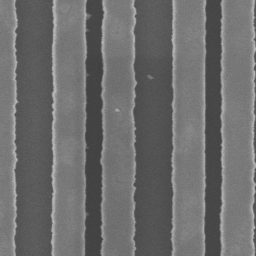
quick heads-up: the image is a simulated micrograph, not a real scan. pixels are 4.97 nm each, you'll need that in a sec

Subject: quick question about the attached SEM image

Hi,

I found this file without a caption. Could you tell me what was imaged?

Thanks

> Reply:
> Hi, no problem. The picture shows lines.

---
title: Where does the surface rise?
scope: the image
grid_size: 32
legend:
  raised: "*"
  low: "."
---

**.....****..****.....****..****
**.....****..****.....****..****
**.....****..****.....****..****
**.....****..****.....****..****
**.....****..****.....****..****
**.....****..****.....****..****
**.....****..****.....****..****
**.....****..****.....****..****
**.....****..****.....****..****
**.....****..****.....****..****
**.....****..****.....****..****
**.....****..****.....****..****
**.....****..****.....****..****
**.....****..****.....****..****
**.....****..****.....****..****
**.....****..****.....****..****
**.....****..****.....****..****
**.....****..****.....****..****
**.....****..****.....****..****
**.....****..****....*****..****
**.....****..****....*****..****
**.....****..****.....****..****
**.....****..****....*****..****
**.....****..****.....****..****
**.....****..****.....****..****
**.....****..****.....****..****
**....*****..****.....****..****
**.....****..****....*****..****
**....*****..****.....***...****
**.....****..****....*****..****
**....*****..****....*****..****
**.....****..****....*****..****